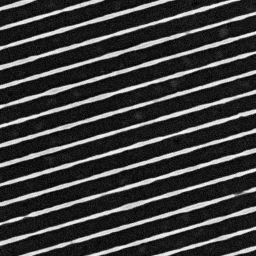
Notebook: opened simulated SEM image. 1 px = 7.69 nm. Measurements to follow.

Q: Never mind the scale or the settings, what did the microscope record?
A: parallel lines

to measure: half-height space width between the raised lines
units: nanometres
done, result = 125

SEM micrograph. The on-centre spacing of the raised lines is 144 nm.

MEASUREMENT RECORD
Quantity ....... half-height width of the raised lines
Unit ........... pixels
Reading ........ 2.89